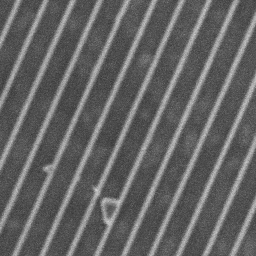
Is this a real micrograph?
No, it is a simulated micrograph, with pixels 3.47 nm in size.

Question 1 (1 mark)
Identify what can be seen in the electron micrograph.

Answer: parallel lines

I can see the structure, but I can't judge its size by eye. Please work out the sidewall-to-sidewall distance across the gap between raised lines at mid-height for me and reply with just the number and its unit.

75.1 nm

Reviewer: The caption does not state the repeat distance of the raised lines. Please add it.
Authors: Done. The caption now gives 0.0865 microns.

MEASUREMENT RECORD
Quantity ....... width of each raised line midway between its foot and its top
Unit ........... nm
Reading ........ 13.5